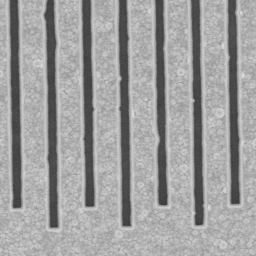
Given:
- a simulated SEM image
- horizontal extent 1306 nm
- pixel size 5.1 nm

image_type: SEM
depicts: parallel lines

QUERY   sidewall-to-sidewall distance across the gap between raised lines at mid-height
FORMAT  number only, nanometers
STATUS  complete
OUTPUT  52.9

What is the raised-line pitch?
186 nm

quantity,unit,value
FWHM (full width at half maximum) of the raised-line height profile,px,26